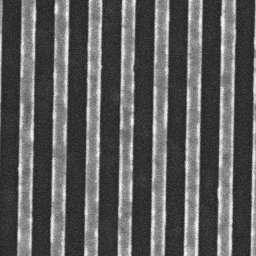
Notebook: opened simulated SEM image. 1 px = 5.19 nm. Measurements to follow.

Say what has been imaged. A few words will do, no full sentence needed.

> parallel lines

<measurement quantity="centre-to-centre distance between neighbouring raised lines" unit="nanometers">173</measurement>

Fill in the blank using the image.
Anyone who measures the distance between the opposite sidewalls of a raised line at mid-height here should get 67.4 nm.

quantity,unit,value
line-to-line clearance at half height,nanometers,104